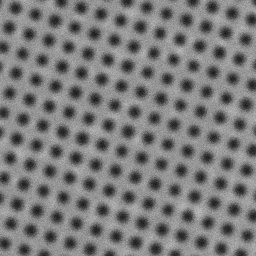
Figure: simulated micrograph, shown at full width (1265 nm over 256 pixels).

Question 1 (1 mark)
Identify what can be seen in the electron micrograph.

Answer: a regular array of holes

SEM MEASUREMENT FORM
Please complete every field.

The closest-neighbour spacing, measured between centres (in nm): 101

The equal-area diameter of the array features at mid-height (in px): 13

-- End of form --